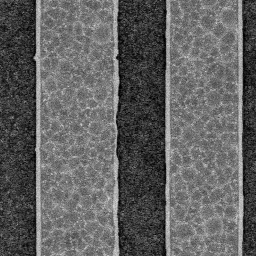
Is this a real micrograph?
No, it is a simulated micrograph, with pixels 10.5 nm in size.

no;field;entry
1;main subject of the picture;one or a few lines or trenches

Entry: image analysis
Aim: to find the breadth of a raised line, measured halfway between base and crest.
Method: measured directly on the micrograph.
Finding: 789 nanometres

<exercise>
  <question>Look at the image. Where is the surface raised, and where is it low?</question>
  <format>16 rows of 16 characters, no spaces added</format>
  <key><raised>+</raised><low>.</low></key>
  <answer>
..+++++....++++.
..+++++...+++++.
..+++++...+++++.
..+++++...+++++.
..+++++...+++++.
..+++++...+++++.
..+++++...+++++.
..+++++...+++++.
..+++++...+++++.
..+++++....++++.
..+++++....++++.
..+++++...+++++.
..+++++...+++++.
..+++++...+++++.
..+++++...+++++.
..+++++...+++++.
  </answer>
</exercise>